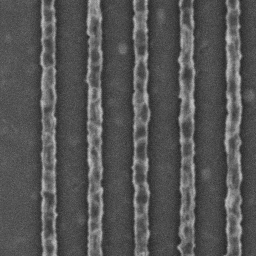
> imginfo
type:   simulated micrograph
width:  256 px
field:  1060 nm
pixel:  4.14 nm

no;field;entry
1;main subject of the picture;parallel lines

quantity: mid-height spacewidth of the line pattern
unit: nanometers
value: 141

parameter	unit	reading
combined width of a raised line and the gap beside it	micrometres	0.191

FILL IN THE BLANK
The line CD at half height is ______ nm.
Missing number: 50.7